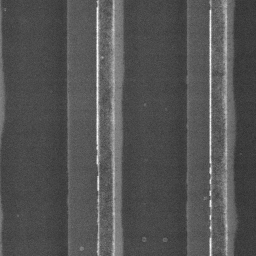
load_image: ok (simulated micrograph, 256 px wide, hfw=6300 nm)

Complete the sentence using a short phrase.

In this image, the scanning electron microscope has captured lines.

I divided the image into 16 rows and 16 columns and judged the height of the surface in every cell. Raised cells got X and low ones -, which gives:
----XXX-----XX--
----XXX-----XX--
----XXX-----XX--
----XXX-----XX--
----XXX-----XX--
----XXX-----XX--
----XXX-----XX--
----XXX-----XX--
----XXX-----XX--
----XXX-----XX--
----XXX-----XX--
----XXX-----XX--
----XXX-----XX--
----XXX-----XX--
----XXX-----XX--
----XXX-----XX--